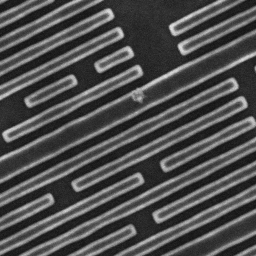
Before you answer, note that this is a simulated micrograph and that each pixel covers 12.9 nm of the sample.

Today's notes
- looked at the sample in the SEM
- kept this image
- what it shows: groups of lines, slits or small figures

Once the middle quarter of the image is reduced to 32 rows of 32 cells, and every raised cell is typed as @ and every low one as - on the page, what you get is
--------@@@@------------------@@
---------@------@@@---------@@@@
---------------@@@@-------@@@@@@
-@-----------@@@@@------@@@@@@@@
@@@--------@@@@@-------@@@@@@@@@
@@-------@@@@@-------@@@@@@@@@@@
-------@@@@@------@@@@@@@@@@@@--
-----@@@@@------@@@@@@@@@@@@----
---@@@@@-------@@@@@@@@@@@------
-@@@@--------@@@@@@@@@@@-------@
@@@@-------@@@@@@@@@@@-------@@@
@@------@@@@@@@@@@@@------@@@@@@
-------@@@@@@@@@@@-------@@@@@--
-----@@@@@@@@@@@-------@@@@@----
--@@@@@@@@@@@@------@@@@@@------
@@@@@@@@@@@@------@@@@@@------@@
@@@@@@@@@@------@@@@@@-------@@@
@@@@@@@@------@@@@@@------@@@@@@
@@@@@@-------@@@@@-------@@@@@--
@@@@------@@@@@@------@@@@@@----
@@-------@@@@@-------@@@@@------
------@@@@@@------@@@@@@------@@
-----@@@@@------@@@@@@------@@@@
--@@@@@@------@@@@@@------@@@@@@
@@@@@@-------@@@@@-------@@@@@--
@@@@------@@@@@----------@@@----
@@------@@@@@@-----------@------
------@@@@@@------------------@@
----@@@@@@------@@@---------@@@@
---@@@@@------@@@@@-------@@@@@@
--@@@@------@@@@@@------@@@@@@--
----------@@@@@@------@@@@@@----